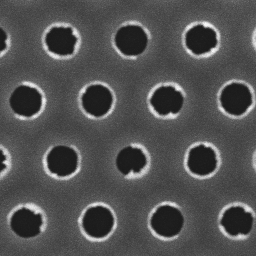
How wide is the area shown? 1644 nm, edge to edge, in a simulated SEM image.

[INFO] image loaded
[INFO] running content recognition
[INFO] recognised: a regular array of holes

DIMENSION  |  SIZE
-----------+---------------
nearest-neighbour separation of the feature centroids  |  0.445 microns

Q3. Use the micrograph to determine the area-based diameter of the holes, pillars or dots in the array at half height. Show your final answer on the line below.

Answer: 0.196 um